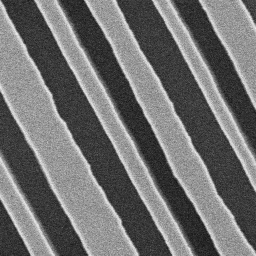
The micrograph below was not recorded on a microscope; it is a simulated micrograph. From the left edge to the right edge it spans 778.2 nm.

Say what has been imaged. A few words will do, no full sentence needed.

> lines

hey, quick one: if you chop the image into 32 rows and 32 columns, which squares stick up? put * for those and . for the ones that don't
.....**....****....**....*****..
*....***...****.....**....*****.
*.....**....****.....**...*****.
**....***....***.....**....*****
**.....**....****.....**...*****
***....***....***.....**....****
***.....**....****.....**...****
****....***....***.....**....***
*****....***...****.....**...***
*****....***....****....**....**
******....***...****.....**...**
******....***....****....**....*
.******....***...****.....**...*
.******.....**....****....**....
..*****.....***...****.....**...
..******.....**....****....**...
...******....***...****.....**..
...******.....**....****.....*..
....******....***...****.....**.
.....*****.....**....****.....**
.....******....***...****.....**
*.....*****.....***...****.....*
**....******....***...****.....*
**.....******....**....****.....
***....******.....**...****.....
***.....******....***...****....
.***....******.....**....****...
..**.....******....***...****...
..***....******.....**....****..
...**.....******....***...****..
...***....*******....**....****.
....***....******....***...*****